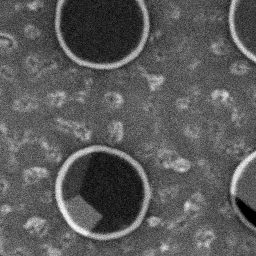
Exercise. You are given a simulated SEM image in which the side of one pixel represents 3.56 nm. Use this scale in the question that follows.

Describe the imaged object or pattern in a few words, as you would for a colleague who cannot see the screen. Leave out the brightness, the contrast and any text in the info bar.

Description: raised bodies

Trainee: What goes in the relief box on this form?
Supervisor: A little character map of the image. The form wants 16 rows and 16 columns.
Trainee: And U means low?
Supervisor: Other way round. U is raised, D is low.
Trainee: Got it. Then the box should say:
DDDDUUUUUDDDDDDU
DDDDUUUUUDDDDDUU
DDDDUUUUUDDDDDDU
DDDDUUUUDDDDDDDD
DDDDDDDDDDDDDDDD
DDDDDDDDDDDDDDDD
DDDDDDDDDDDDDDDD
DDDDDDDDDDDDDDDD
DDDDDDDDDDDDDDDD
DDDDDUUDDDDDDDDD
DDDDUUUUUDDDDDDU
DDDDUUUUUDDDDDDU
DDDDUUUUUDDDDDDU
DDDDUUUUUDDDDDDU
DDDDDUUUDDDDDDDD
DDDDDDDDDDDDDDDD